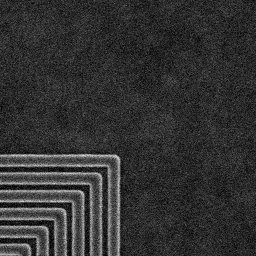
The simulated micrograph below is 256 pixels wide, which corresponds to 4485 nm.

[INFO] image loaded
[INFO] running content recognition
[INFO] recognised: groups of lines, slits or small figures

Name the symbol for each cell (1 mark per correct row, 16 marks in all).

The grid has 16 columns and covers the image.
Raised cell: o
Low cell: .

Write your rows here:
................
................
................
................
................
................
................
................
................
................
ooooooo.........
ooooooo.........
ooooooo.........
ooooooo.........
ooooooo.........
ooooooo.........